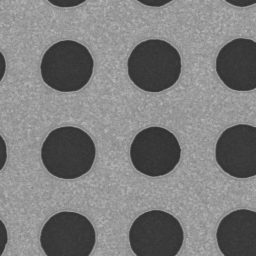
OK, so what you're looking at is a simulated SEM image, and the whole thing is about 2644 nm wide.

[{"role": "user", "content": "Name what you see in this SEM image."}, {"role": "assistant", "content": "holes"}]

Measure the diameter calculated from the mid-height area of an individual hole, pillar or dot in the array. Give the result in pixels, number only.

53.2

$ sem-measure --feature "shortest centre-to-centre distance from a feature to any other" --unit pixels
86.3